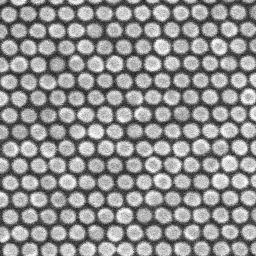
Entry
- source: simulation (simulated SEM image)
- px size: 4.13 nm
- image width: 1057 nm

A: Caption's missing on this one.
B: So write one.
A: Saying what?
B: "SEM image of a regular array of raised bodies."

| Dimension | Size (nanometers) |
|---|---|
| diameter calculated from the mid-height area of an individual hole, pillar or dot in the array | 58.2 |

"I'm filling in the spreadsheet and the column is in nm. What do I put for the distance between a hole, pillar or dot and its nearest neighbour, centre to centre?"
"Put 77.3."